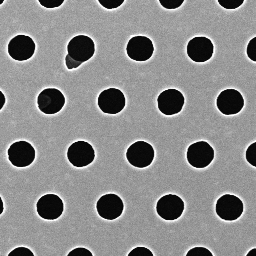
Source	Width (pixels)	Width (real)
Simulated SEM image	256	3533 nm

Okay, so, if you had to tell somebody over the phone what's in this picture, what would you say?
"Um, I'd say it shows a regular array of holes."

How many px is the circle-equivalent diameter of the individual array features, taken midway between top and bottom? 27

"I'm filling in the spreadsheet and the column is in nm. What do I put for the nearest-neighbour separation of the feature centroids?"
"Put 822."